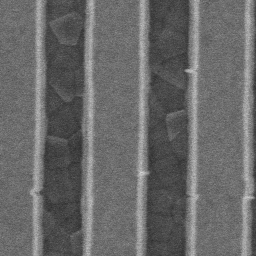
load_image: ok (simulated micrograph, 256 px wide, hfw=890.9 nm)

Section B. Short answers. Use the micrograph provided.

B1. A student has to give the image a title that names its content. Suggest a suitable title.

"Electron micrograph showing one or a few lines or trenches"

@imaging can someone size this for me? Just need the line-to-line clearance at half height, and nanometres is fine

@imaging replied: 184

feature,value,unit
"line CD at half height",181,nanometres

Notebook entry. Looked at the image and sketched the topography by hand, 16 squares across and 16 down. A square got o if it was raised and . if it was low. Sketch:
oo....ooo...ooo.
oo....ooo...ooo.
oo....ooo...ooo.
oo....ooo...ooo.
oo....ooo...ooo.
oo....ooo...ooo.
oo....ooo...ooo.
oo....ooo...ooo.
oo....ooo...ooo.
oo....ooo...ooo.
oo....ooo...ooo.
oo....ooo...ooo.
oo....ooo...ooo.
oo....ooo...ooo.
oo....ooo...ooo.
oo...oooo...ooo.